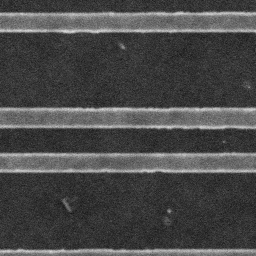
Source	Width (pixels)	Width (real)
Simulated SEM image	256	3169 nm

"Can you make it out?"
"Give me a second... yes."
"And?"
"lines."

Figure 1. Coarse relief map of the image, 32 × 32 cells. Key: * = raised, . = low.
................................
................................
********************************
********************************
................................
................................
................................
................................
................................
................................
................................
................................
................................
................................
********************************
********************************
................................
................................
................................
********************************
********************************
................................
................................
................................
................................
........*.......................
................................
................................
................................
................................
................................
********************************